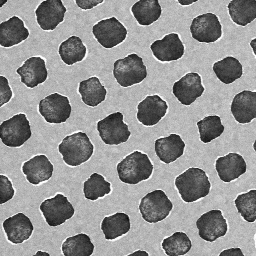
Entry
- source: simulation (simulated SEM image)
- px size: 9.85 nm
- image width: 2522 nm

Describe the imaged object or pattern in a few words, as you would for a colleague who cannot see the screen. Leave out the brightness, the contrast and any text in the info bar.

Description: a regular array of holes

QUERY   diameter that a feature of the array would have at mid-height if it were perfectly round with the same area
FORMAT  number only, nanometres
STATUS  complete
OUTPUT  301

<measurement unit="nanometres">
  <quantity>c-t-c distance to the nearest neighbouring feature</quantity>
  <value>421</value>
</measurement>